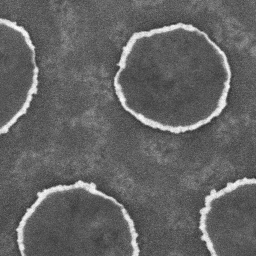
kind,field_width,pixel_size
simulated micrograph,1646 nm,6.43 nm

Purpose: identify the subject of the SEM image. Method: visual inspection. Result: raised bodies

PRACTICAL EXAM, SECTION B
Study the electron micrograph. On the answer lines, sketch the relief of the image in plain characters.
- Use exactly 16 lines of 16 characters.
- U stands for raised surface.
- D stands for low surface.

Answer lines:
DDDDDDDDDDDDDDDD
UDDDDDDDDDDDDDDD
UUDDDDDDUUUUUDDD
UUDDDDDDUUUUUUDD
UUDDDDDUUUUUUUDD
UUDDDDDUUUUUUUDD
UUDDDDDDUUUUUUDD
UDDDDDDDDUUUUDDD
DDDDDDDDDDDDDDDD
DDDDDDDDDDDDDDDD
DDDDDDDDDDDDDDDD
DDDDDUDDDDDDDDUU
DDUUUUUDDDDDDUUU
DDUUUUUUDDDDDUUU
DUUUUUUUDDDDDUUU
DUUUUUUUUDDDDUUU